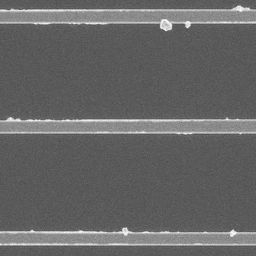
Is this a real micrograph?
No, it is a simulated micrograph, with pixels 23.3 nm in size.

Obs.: lines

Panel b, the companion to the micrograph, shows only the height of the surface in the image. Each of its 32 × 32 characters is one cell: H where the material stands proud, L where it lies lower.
LLLLLLLLLLLLLLLLLLLLLLLLLLLLLLLL
HHHHHHHHHHHHHHHHHHHHHHHHHHHHHHHH
HHHHHHHHHHHHHHHHHHHHHHHHHHHHHHHH
LLLLLLLLLLLLLLLLLLLLHLLLLLLLLLLL
LLLLLLLLLLLLLLLLLLLLLLLLLLLLLLLL
LLLLLLLLLLLLLLLLLLLLLLLLLLLLLLLL
LLLLLLLLLLLLLLLLLLLLLLLLLLLLLLLL
LLLLLLLLLLLLLLLLLLLLLLLLLLLLLLLL
LLLLLLLLLLLLLLLLLLLLLLLLLLLLLLLL
LLLLLLLLLLLLLLLLLLLLLLLLLLLLLLLL
LLLLLLLLLLLLLLLLLLLLLLLLLLLLLLLL
LLLLLLLLLLLLLLLLLLLLLLLLLLLLLLLL
LLLLLLLLLLLLLLLLLLLLLLLLLLLLLLLL
LLLLLLLLLLLLLLLLLLLLLLLLLLLLLLLL
LLLLLLLLLLLLLLLLLLLLLLLLLLLLLLLL
HHHHHHHHHHHHHHHHHHHHHHHHHHHHHHHH
HHHHHHHHHHHHHHHHHHHHHHHHHHHHHHHH
LLLLLLLLLLLLLLLLLLLLLLLLLLLLLLLL
LLLLLLLLLLLLLLLLLLLLLLLLLLLLLLLL
LLLLLLLLLLLLLLLLLLLLLLLLLLLLLLLL
LLLLLLLLLLLLLLLLLLLLLLLLLLLLLLLL
LLLLLLLLLLLLLLLLLLLLLLLLLLLLLLLL
LLLLLLLLLLLLLLLLLLLLLLLLLLLLLLLL
LLLLLLLLLLLLLLLLLLLLLLLLLLLLLLLL
LLLLLLLLLLLLLLLLLLLLLLLLLLLLLLLL
LLLLLLLLLLLLLLLLLLLLLLLLLLLLLLLL
LLLLLLLLLLLLLLLLLLLLLLLLLLLLLLLL
LLLLLLLLLLLLLLLLLLLLLLLLLLLLLLLL
LLLLLLLLLLLLLLLLLLLLLLLLLLLLLLLL
HHHHHHHHHHHHHHHHHHHHHHHHHHHHHHHH
HHHHHHHHHHHHHHHHHHHHHHHHHHHHHHHH
LLLLLLLLLLLLLLLLLLLLLLLLLLLLLLLL